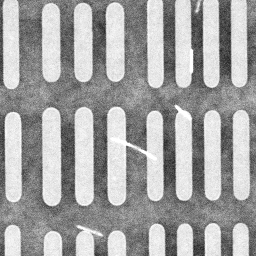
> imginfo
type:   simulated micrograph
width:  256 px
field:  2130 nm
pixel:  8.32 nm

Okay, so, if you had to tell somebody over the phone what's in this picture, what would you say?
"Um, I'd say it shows groups of lines, slits or small figures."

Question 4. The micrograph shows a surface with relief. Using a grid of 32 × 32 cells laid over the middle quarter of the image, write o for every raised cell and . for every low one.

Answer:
...oooo....oooo......oooo...oooo
...oooo....oooo......oooo...oooo
...oooo....oooo......oooo...oooo
...oooo....ooo.......oooo...oooo
.....................oooo...oooo
......................oo.....oo.
................................
................................
................................
................................
................................
....oo......ooo.................
...oooo....oooo......ooo....ooo.
...oooo....oooo......oooo...oooo
...oooo....oooo......oooo...oooo
...oooo....oooo......oooo...oooo
...oooo....oooo......oooo...oooo
...oooo....oooo......oooo...oooo
...oooo....oooo......oooo...oooo
...oooo....ooooo.....oooo...oooo
...oooo....ooooo.....oooo...oooo
...oooo....oooo......oooo...oooo
...oooo....oooo.....ooooo...oooo
...oooo....oooo......oooo...oooo
...oooo....oooo......oooo...oooo
...oooo....oooo......oooo...oooo
...oooo....oooo......oooo...oooo
...oooo....oooo......oooo...oooo
...oooo....oooo......oooo...oooo
...oooo....oooo......oooo...oooo
...oooo....oooo......oooo...oooo
...oooo....oooo......oooo...oooo